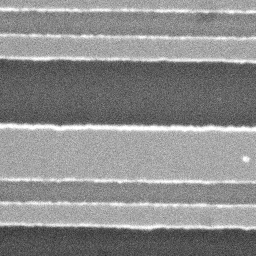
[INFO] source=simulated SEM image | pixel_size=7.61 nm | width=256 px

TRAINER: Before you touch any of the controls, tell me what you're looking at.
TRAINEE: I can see lines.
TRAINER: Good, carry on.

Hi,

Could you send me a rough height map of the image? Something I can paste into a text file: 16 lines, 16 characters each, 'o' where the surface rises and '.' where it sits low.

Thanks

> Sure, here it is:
oooooooooooooooo
oooooooooooooooo
oooooooooooooooo
oooooooooooooooo
................
................
................
................
oooooooooooooooo
oooooooooooooooo
oooooooooooooooo
oooooooooooooooo
oooooooooooooooo
oooooooooooooooo
................
................